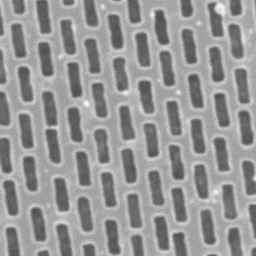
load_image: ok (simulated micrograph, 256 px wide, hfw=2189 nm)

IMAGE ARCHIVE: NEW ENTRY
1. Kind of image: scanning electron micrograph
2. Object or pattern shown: a regular array of holes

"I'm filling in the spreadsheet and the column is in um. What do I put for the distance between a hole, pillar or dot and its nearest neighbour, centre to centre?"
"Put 0.264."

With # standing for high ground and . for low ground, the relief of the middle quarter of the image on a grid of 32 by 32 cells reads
#...##...###...####...##...#####
#...##...###...#########...#####
#...###.#####...########....####
#...#########...#########...###.
#...#########...###...###...###.
#....##...###...##....###..####.
#....##...###...###...#########.
##...##...#########...#########.
##.####...#########...##########
#######....########...####..####
########...###..###....##....###
#...####...###..####...###...###
#...####...###...###.#####...###
#...#####.####...#########...###
#...##########...#########...###
#...##########...###...###...###
#...####..####....##...###....##
##...##....###....##...####..###
##...##....###....##....########
##..####...#########....########
########...#########....##...###
########...####..####...##...###
###...##....##...####...##...###
###...##...###....###.####...###
###...###..####...#########...##
###...#########...#########...##
###....########...#########...##
###....##...###...###...###...##
####...##...###...###...###...##
####...##...####..###...########
.###..###....########...########
.#########...#########...##...##